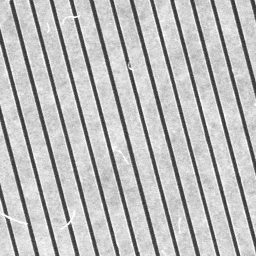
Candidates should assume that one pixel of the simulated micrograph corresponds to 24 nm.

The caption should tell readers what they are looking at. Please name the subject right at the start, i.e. parallel lines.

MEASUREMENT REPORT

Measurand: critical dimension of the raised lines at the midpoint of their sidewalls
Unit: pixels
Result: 14.9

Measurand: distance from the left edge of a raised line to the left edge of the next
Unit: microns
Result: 0.466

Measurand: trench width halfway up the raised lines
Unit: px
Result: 4.72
